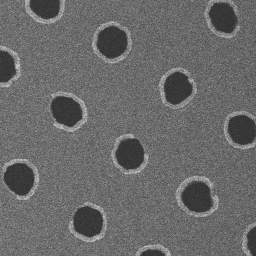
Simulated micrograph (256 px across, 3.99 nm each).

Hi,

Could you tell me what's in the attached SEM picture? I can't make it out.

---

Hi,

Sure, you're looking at a regular array of holes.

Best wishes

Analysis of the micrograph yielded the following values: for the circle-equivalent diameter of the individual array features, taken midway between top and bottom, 0.12 microns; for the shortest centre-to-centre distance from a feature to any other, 319 nm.